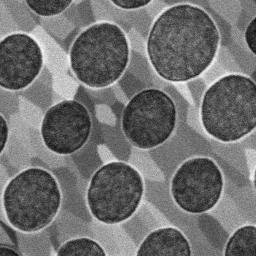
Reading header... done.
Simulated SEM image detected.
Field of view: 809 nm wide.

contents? holes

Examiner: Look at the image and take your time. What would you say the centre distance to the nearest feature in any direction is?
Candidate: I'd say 254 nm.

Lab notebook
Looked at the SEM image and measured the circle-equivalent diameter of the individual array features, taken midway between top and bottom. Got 183 nm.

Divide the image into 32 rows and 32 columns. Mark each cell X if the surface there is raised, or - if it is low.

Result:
XXX------XXXXX----XXXXXXXXXXXXXX
XXXX----XXXXXXXXXXXX------XXXXXX
XXXXXXXXXXXXXXXXXXX--------XXXXX
XXXXXXXXXXX----XXXX--------XXXX-
X---XXXXXX------XXX--------XXXX-
-----XXXX-------XX---------XXXX-
-----XXXX-------XX---------XXXXX
-----XXXX-------XXX--------XXXXX
-----XXXX-------XXX-------XXXXXX
-----XXXX------XXXXX-----XXX---X
----XXXXXX----XXXXXXXXXXXXX-----
XXXXXXXXXXXXXXXXXX--XXXXXX------
XXXXXXXXXXXXXXXX-----XXXX-------
XXXXXX-----XXXXX------XXX-------
XXXXXX-----XXXX-------XXX-------
-XXXX------XXXX-------XXX-------
-XXXX------XXXX------XXXXX-----X
-XXXX------XXXXX-----XXXXXX---XX
XXXXXX----XXXXXXX--XXXXXXXXXXXXX
XXXXXXXXXXXXXXXXXXXXXXXXXXXXXXXX
XXXXXXXXXXXXX---XXXXXXX----XXXXX
XXX---XXXXXX-----XXXXX------XXXX
X------XXXX-------XXX-------XXXX
X------XXXX-------XXX-------XXXX
--------XXX-------XXXX------XXXX
--------XXX------XXXXX-----XXXXX
X------XXXX------XXXXXXX-XXXXXXX
X------XXXXX----XXXXXXXXXXXXXXXX
XX---XXXXXXXXXXXXXXX--XXXXXXXX--
XXXXXXXXXXXXXXXXXX-----XXXXXX---
XXXXXXXX----XXXXXX------XXXX----
--XXXXX------XXXX-------XXXX----